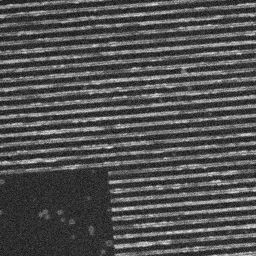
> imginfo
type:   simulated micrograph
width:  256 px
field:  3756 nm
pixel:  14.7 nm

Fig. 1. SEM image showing parallel lines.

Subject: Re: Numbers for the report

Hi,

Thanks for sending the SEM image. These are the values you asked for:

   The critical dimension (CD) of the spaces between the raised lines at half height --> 93.2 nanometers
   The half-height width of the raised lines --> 43.8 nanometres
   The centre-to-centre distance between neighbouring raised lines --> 0.135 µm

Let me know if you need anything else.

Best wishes